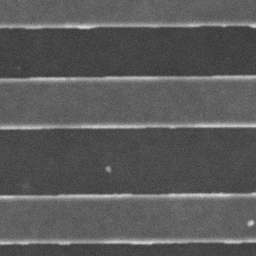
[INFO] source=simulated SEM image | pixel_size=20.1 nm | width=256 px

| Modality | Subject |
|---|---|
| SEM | lines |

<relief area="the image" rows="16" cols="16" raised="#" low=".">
################
################
................
................
................
################
################
################
................
................
................
................
################
################
################
................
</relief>